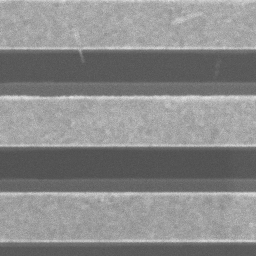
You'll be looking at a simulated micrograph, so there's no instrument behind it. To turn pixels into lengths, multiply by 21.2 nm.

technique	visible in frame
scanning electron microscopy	lines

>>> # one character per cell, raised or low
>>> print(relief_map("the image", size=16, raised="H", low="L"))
HHHHHHHHHHHHHHHH
HHHHHHHHHHHHHHHH
HHHHHHHHHHHHHHHH
LLLLLLLLLLLLLLLL
LLLLLLLLLLLLLLLL
HHHHHHHHHHHHHHHH
HHHHHHHHHHHHHHHH
HHHHHHHHHHHHHHHH
HHHHHHHHHHHHHHHH
LLLLLLLLLLLLLLLL
LLLLLLLLLLLLLLLL
HHHHHHHHHHHHHHHH
HHHHHHHHHHHHHHHH
HHHHHHHHHHHHHHHH
HHHHHHHHHHHHHHHH
LLLLLLLLLLLLLLLL